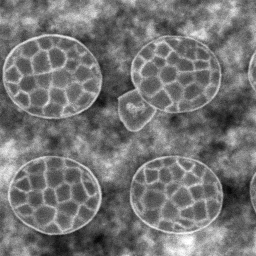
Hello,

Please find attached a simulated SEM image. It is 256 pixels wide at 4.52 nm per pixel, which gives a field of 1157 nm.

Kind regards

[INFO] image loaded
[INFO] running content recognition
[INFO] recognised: raised bodies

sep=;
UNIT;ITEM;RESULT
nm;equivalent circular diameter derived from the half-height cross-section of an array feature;390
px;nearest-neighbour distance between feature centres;118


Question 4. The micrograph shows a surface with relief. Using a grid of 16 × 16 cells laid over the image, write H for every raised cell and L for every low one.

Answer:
LLLLLLLLLLLLLLLL
LLLLLLLLLLLLLLLL
LLHHHLLLLLHHLLLL
LHHHHHLLLHHHHLLL
HHHHHHLLHHHHHHLL
HHHHHHLLHHHHHHLL
LHHHHHLLHHHHHLLL
LLLLLLLLHLLLLLLL
LLLLLLLLLLLLLLLL
LLLLLLLLLLLLLLLL
LHHHHLLLLHHHHLLL
LHHHHHLLHHHHHHLL
LHHHHHLLHHHHHHLL
LHHHHHLLLHHHHHLL
LLLHLLLLLLHHLLLL
LLLLLLLLLLLLLLLL